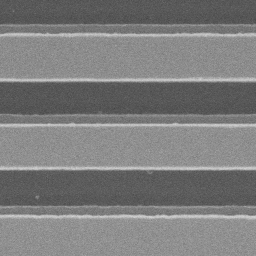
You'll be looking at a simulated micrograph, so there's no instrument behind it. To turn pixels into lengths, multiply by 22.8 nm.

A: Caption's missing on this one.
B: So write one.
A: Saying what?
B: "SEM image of lines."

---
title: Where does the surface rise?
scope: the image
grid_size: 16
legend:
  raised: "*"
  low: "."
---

................
................
****************
****************
****************
................
................
****************
****************
****************
****************
................
................
****************
****************
****************